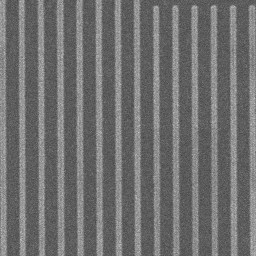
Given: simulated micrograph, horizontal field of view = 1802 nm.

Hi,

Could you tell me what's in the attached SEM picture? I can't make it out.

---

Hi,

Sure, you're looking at parallel lines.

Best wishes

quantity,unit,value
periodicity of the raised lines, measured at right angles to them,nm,135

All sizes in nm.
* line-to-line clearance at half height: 95.9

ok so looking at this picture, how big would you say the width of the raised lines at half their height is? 36.1 nanometres